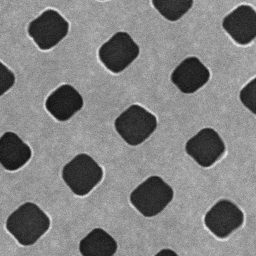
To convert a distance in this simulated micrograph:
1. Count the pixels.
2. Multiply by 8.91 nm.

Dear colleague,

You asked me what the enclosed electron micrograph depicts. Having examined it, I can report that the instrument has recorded a regular array of holes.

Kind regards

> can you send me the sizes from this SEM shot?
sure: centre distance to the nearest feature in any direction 0.653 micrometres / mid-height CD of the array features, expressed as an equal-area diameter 337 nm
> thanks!